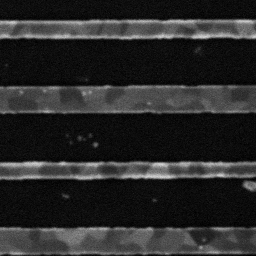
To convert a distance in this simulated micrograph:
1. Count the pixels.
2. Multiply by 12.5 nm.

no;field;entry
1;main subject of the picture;lines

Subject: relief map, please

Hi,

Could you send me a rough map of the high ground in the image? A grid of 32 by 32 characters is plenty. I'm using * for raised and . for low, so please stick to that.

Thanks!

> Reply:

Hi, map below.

................................
................................
................................
********************************
********************************
................................
................................
................................
................................
................................
................................
********************************
********************************
********************************
................................
................................
................................
................................
................................
................................
********************************
********************************
................................
................................
................................
................................
................................
................................
................................
********************************
********************************
********************************